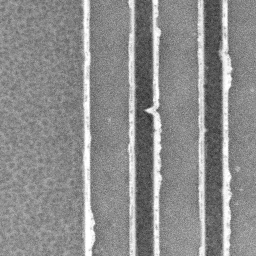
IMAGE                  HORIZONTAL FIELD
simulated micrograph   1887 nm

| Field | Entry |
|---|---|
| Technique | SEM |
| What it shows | one or a few lines or trenches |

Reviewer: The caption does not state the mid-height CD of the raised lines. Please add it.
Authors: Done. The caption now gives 348 nm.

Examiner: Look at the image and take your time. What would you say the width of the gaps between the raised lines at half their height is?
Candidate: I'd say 158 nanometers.